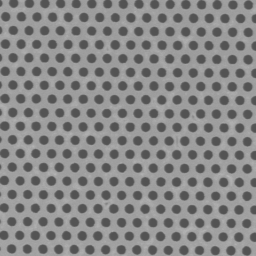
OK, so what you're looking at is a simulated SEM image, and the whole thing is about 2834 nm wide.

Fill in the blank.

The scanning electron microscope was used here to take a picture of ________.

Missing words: a regular array of holes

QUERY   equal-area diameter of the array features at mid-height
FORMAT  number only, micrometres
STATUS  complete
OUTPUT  0.103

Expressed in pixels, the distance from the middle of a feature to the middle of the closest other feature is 15.5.